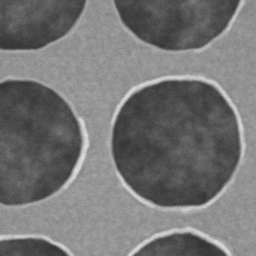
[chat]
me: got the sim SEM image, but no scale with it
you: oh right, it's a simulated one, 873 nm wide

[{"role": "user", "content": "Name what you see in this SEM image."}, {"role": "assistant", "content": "holes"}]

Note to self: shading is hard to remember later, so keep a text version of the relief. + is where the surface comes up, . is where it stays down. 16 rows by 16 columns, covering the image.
.....++........+
.....+++......++
....+++++....+++
++++++++++++++++
++++++++++++++++
...++++++....+++
....++++......++
.....++........+
.....++........+
.....++........+
.....++........+
....++++......++
...++++++....+++
++++++++++++++++
++++++++++++++++
....+++++.....++